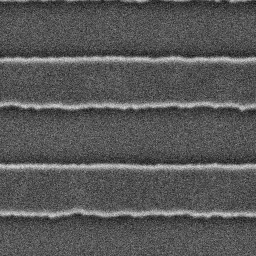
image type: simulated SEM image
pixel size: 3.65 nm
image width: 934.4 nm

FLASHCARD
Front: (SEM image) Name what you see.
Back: lines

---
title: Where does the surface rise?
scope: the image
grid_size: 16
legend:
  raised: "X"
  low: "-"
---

----------------
----------------
----------------
----------------
XXXXXXXXXXXXXXXX
XXXXXXXXXXXXXXXX
XXXXXXXXXXXXXXXX
----------------
----------------
----------------
XXXXXXXXXXXXXXXX
XXXXXXXXXXXXXXXX
XXXXXXXXXXXXXXXX
----------------
----------------
----------------